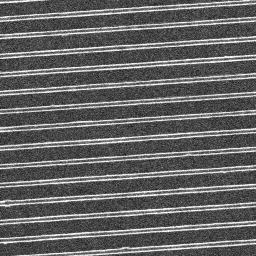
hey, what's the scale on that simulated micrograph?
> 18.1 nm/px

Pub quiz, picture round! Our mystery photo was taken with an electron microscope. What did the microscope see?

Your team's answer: parallel lines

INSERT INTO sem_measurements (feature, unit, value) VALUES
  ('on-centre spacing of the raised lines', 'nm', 334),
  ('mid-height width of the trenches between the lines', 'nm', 264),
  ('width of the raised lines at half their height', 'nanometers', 70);